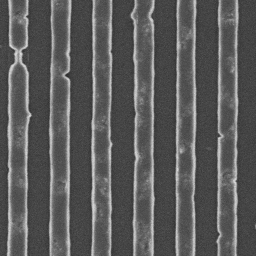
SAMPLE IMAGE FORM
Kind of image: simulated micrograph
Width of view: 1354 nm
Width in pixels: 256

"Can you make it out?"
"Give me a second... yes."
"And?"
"parallel lines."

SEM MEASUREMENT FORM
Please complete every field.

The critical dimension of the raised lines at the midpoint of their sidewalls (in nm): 93.1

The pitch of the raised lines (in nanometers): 221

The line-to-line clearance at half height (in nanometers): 126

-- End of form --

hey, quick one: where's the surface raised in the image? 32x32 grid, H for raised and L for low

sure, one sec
LHHLLLHHHLLLHHLLLHHLLLHHLLLHHHLL
LHHLLLHHHLLLHHLLLHHLLLHHLLLHHHLL
LHHLLLHHHLLLHHLLLHHLLLHHLLLHHHLL
LHHLLLHHHLLLHHLLLHHLLLHHLLLHHHLL
LHHLLLLHHLLLHHLLLHHLLLHHLLLHHHLL
LHHLLLLHHLLLHHLLLHHLLLHHLLLHHLLL
LLHLLLLHHLLLHHLLLHHLLLHHLLLHHLLL
LLHLLLLHHLLLHHLLLHHLLLHHLLLHHHLL
LHHLLLHHHLLLHHLLLHHLLLHHLLLHHHLL
LHHLLLHHLLLLHHLLLHHLLLHHLLLHHHLL
LHHLLLHHHLLLHHLLLHHLLLHHLLLHHHLL
LHHLLLHHHLLLHHLLLHHLLLHHLLLHHHLL
LHHLLLHHHLLLHHLLLHHLLLHHLLLHHHLL
LHHHLLHHHLLLHHLLLHHLLLHHLLLHHHLL
LHHHLLHHHLLLHHLLLHHLLLHHLLLHHHLL
LHHHLLHHHLLLHHLLLHHLLLHHLLLHHHLL
LHHLLLHHHLLLHHLLLHHLLLHHLLLHHHLL
LHHLLLHHHLLLHHLLLHHLLLHHLLLHHLLL
LHHLLLHHHLLLHHLLLHHLLLHHLLLHHHLL
LHHLLLHHHLLLHHLLLHHLLLHHLLLHHHLL
LHHLLLHHHLLLHHLLLHHLLLHHLLLHHHLL
LHHLLLHHHLLLHHLLLHHLLLHHLLLHHHLL
LHHLLLHHHLLLHHLLLHHLLLHHLLLHHHLL
LHHLLLHHHLLLHHLLLHHLLLHHLLLHHHLL
LHHLLLHHHLLLHHLLLHHLLLHHLLLHHHLL
LHHLLLHHHLLLHHLLLHHLLLHHLLLHHHLL
LHHLLLHHLLLLHHLLLHHLLLHHLLLHHHLL
LHHLLLHHHLLLHHLLLHHLLLHHLLLHHHLL
LHHLLLHHHLLLHHLLLHHLLLHHLLLHHLLL
LHHLLLHHHLLLHHLLLHHLLLHHLLLHHLLL
LHHLLLHHHLLLHHLLLHHLLLHHLLLHHLLL
LHHLLLHHHLLLHHLLLHHLLLHHLLLHHLLL